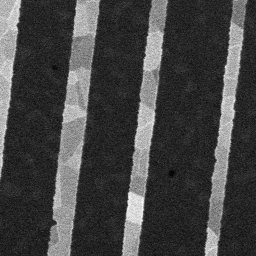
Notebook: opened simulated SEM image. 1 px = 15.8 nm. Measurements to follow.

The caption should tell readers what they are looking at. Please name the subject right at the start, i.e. one or a few lines or trenches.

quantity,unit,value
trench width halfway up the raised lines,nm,896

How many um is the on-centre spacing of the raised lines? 1.19